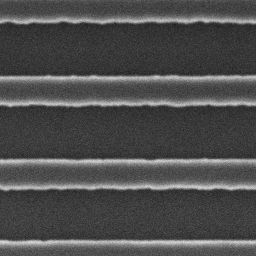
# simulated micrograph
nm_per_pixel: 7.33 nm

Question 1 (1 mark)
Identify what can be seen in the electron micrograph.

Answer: lines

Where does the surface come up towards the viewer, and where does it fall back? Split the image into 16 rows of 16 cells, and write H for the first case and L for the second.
HHHHHHHHHHHHHHHH
LLLLLLLLLLLLLLLL
LLLLLLLLLLLLLLLL
LLLLLLLLLLLLLLLL
LLLLLLLLLLLLLLLL
HHHHHHHHHHHHHHHH
HHHHHHHHHHHHHHHH
LLLLLLLLLLLLLLLL
LLLLLLLLLLLLLLLL
LLLLLLLLLLLLLLLL
HHHHHHHHHHHHHHHH
HHHHHHHHHHHHHHHH
LLLLLLLLLLLLLLLL
LLLLLLLLLLLLLLLL
LLLLLLLLLLLLLLLL
HHHHHHHHHHHHHHHH